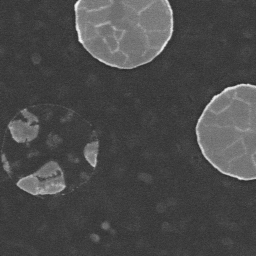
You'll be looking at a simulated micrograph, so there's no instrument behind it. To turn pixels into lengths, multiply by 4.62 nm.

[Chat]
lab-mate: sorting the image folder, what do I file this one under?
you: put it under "raised bodies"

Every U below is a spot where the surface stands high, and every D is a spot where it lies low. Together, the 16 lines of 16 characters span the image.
DDDDDUUUUUUDDDDD
DDDDDUUUUUUDDDDD
DDDDDUUUUUUDDDDD
DDDDDDUUUUDDDDDD
DDDDDDDDDDDDDDDD
DDDDDDDDDDDDDDUU
DDDDDDDDDDDDDUUU
DDDDDDDDDDDDUUUU
DDDDDDDDDDDDUUUU
DDDDDDDDDDDDDUUU
DDDDDDDDDDDDDDUU
DDDDDDDDDDDDDDDD
DDDDDDDDDDDDDDDD
DDDDDDDDDDDDDDDD
DDDDDDDDDDDDDDDD
DDDDDDDDDDDDDDDD